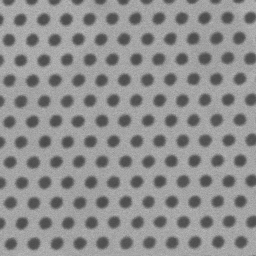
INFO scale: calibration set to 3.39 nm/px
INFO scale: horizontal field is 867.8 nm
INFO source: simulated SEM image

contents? a regular array of holes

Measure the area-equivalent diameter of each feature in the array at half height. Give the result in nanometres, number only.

44.1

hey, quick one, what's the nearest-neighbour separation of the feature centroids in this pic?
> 77.1 nm